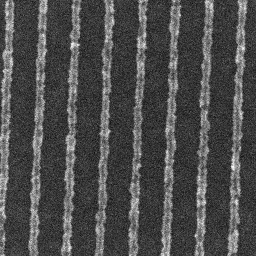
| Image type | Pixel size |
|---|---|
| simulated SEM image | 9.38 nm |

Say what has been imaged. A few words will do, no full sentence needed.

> parallel lines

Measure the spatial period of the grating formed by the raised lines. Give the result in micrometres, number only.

0.31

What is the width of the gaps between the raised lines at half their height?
259 nm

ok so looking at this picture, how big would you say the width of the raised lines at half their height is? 49.2 nm